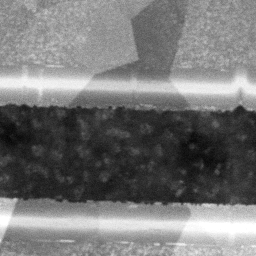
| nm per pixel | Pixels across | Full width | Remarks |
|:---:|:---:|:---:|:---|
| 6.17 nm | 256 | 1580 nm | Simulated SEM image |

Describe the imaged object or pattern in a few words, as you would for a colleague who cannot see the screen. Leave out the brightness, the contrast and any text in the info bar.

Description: one or a few lines or trenches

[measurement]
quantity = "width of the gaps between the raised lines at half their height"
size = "853 nm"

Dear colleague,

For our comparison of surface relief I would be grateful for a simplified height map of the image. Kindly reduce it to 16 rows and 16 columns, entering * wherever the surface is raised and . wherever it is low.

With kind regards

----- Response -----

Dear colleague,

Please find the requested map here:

****************
****************
****************
****************
****************
............**..
................
................
................
................
................
................
................
................
****************
****************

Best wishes